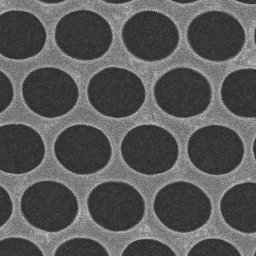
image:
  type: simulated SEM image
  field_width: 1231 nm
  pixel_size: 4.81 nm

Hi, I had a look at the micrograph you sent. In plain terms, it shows a regular array of holes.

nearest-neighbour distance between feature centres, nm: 317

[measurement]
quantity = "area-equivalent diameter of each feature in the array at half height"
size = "257 nm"